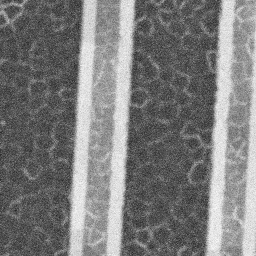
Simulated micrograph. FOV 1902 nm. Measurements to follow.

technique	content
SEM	one or a few lines or trenches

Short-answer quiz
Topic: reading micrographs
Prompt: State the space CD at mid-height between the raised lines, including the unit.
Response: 0.746 µm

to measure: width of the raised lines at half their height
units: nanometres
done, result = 272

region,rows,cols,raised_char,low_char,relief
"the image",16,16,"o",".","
......oo......oo
......oo......oo
......oo......oo
.....ooo......oo
.....ooo......oo
.....ooo......oo
.....ooo......oo
.....ooo......oo
.....ooo......oo
.....oo.......oo
.....oo.......oo
.....oo.......oo
.....oo.......oo
.....oo......ooo
.....oo......ooo
.....oo......ooo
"